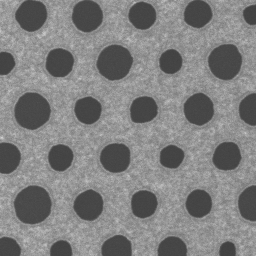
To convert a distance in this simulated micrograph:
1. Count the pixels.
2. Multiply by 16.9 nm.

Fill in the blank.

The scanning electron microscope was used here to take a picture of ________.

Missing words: a regular array of holes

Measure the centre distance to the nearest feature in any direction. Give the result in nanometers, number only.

921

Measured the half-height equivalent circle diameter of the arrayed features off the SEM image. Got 28.9 pixels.